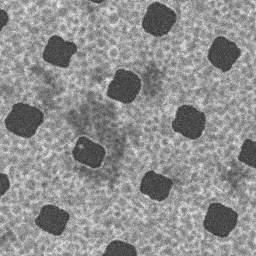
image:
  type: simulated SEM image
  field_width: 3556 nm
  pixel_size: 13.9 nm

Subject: a regular array of holes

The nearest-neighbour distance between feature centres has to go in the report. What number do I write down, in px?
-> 72.9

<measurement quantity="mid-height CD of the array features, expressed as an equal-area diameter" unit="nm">467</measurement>